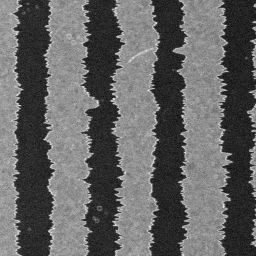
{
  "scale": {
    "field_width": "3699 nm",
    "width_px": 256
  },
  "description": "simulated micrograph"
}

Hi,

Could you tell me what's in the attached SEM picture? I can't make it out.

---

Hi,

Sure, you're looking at one or a few lines or trenches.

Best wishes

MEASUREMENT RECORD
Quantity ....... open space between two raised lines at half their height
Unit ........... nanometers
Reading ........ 455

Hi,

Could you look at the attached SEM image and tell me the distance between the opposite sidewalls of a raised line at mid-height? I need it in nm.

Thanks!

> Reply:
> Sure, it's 525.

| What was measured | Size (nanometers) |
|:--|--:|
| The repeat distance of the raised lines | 976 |